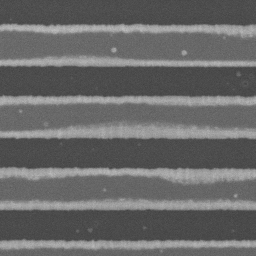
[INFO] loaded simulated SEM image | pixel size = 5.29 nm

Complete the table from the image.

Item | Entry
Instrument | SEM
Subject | lines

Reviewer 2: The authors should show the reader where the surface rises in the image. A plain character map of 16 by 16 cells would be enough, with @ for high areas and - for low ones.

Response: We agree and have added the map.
----------------
----------------
@@@@@@@@@@@@@@@@
@@@@@@@@@@@@@@@@
----------------
----------------
@@@@@@@@@@@@@@@@
@@@@@@@@@@@@@@@@
@@@@@--------@@@
----------------
----------------
@@@@@@@@@@@@@@@@
@@@@@@@@@@@@@@@@
----------------
----------------
@@@@@@@@@@@@@@@@